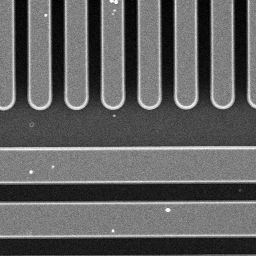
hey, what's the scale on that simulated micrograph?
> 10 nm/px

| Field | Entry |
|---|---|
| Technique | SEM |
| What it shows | groups of lines, slits or small figures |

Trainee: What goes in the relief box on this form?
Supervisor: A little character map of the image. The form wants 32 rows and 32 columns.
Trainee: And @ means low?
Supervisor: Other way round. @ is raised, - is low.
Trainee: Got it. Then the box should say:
@@--@@--@@@--@@--@@@--@@@-@@@--@
@@--@@--@@@--@@--@@@--@@@-@@@--@
@@--@@--@@@--@@--@@@--@@@-@@@--@
@@--@@--@@@--@@--@@@--@@@-@@@--@
@@--@@--@@@--@@--@@@--@@@-@@@--@
@@--@@--@@@--@@--@@@--@@@-@@@--@
@@--@@--@@@--@@--@@@--@@@-@@@--@
@@--@@--@@@--@@--@@@--@@@-@@@--@
@@--@@--@@@--@@--@@@--@@@-@@@--@
@@--@@--@@@--@@--@@@--@@@-@@@--@
@@--@@--@@@--@@@-@@@--@@@-@@@--@
@@--@@--@@@--@@@-@@@--@@@-@@@--@
@@--@@--@@@--@@--@@@--@@@--@@--@
@---@----@----------------------
--------------------------------
--------------------------------
--------------------------------
--------------------------------
-----------------@@@@@@@@@@@@@@@
@@@@@@@@@@@@@@@@@@@@@@@@@@@@@@@@
@@@@@@@@@@@@@@@@@@@@@@@@@@@@@@@@
@@@@@@@@@@@@@@@@@@@@@@@@@@@@@@@@
@@@@@@@@@@@@@@@@@@@@@@@@@@@@@@@@
--------------------------------
--------------------------------
@@@@@@@@@@@@@@@@@@@@@@@@@@@@@@@@
@@@@@@@@@@@@@@@@@@@@@@@@@@@@@@@@
@@@@@@@@@@@@@@@@@@@@@@@@@@@@@@@@
@@@@@@@@@@@@@@@@@@@@@@@@@@@@@@@@
@@@@@@@@@@@@@@@@@@@@@@@@@@@@@@@@
--------------------------------
--------------------------------